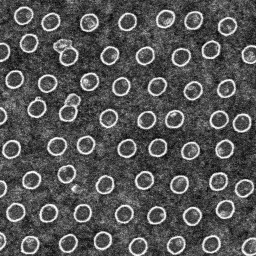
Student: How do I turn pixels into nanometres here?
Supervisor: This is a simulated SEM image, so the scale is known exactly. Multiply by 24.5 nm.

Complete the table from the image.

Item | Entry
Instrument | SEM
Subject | a regular array of raised bodies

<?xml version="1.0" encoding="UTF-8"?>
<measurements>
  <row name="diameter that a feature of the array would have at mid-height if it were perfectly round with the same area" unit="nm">421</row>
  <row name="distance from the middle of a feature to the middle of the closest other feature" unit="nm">790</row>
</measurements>